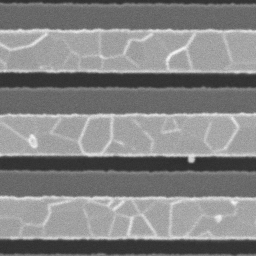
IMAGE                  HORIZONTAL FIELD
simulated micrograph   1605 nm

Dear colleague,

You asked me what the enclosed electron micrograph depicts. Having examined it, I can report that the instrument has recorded lines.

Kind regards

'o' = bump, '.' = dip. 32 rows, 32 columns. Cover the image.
oooooo..o.......................
oooooooooooooooooooooooooooooooo
oooooooooooooooooooooooooooooooo
oooooooooooooooooooooooooooooooo
oooooooooooooooooooooooooooooooo
oooooooooooooooooooooooooooooooo
oooooooooooooooooooooooooooooooo
oooooooooooooooooooooooooooooooo
oooooooooooooooooooooooooooooooo
................................
................................
oooooooooooooooooooooooooooooooo
oooooooooooooooooooooooooooooooo
oooooooooooooooooooooooooooooooo
oooooooooooooooooooooooooooooooo
oooooooooooooooooooooooooooooooo
oooooooooooooooooooooooooooooooo
oooooooooooooooooooooooooooooooo
oooooooooooooooooooooooooooooooo
.......................oo.......
................................
oooooooooooooooooooooooooooooooo
oooooooooooooooooooooooooooooooo
oooooooooooooooooooooooooooooooo
oooooooooooooooooooooooooooooooo
oooooooooooooooooooooooooooooooo
oooooooooooooooooooooooooooooooo
oooooooooooooooooooooooooooooooo
oooooooooooooooooooooooooooooooo
oooooooooooooooooooooooooooooooo
................................
................................